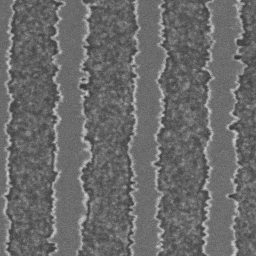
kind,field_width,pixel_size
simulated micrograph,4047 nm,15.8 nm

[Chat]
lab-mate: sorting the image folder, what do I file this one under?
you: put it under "one or a few lines or trenches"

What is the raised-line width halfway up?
437 nanometres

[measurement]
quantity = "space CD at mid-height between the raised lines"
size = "756 nanometres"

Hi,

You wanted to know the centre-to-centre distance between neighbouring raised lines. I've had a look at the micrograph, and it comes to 1.2 microns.